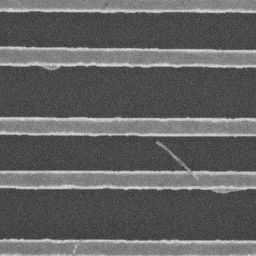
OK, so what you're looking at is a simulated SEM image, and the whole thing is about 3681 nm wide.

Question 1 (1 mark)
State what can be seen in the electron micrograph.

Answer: lines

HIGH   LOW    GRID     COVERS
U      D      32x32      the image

UUUUUUUUUUUUUUUUUUUUUUUUUUUUUUUU
DDDDDDDDDDDDDDDDDDDDDDDDDDDUDDUU
DDDDDDDDDDDDDDDDDDDDDDDDDDDDDDDD
DDDDDDDDDDDDDDDDDDDDDDDDDDDDDDDD
DDDDDDDDDDDDDDDDDDDDDDDDDDDDDDDD
DDDDDDDDDDDDDDDDDDDDDDDDDDDDDDDD
UUUUUUUUUUUUUUUUUUUUUUUUUUUUUUUU
UUUUUUUUUUUUUUUUUUUUUUUUUUUUUUUU
DDDDDDUDDDDDDDDDDDDDDDDDDDDDDDDD
DDDDDDDDDDDDDDDDDDDDDDDDDDDDDDDD
DDDDDDDDDDDDDDDDDDDDDDDDDDDDDDDD
DDDDDDDDDDDDDDDDDDDDDDDDDDDDDDDD
DDDDDDDDDDDDDDDDDDDDDDDDDDDDDDDD
DDDDDDDDDDDDDDDDDDDDDDDDDDDDDDDD
DDDDDDDDDDDDDDDDDDDDDDDDDDDDDDDD
UUUUUUUUUUUUUUUUUUUUUUUUUUUUUUUU
UUUUUUUUUUUUUUUUUUUUUUUUUUUUUUUU
DDDDDDDDDDDDDDDDDDDDDDDDDDDDDDDD
DDDDDDDDDDDDDDDDDDDDDDDDDDDDDDDD
DDDDDDDDDDDDDDDDDDDDDDDDDDDDDDDD
DDDDDDDDDDDDDDDDDDDDDDDDDDDDDDDD
UUUUUUUUUUUUUDDDDDDDDDDUDDDDDDDD
UUUUUUUUUUUUUUUUUUUUUUUUUUUUUUUU
DDUUUUUUDUUUUDUUUUUUUUUUUUUUUUUU
DDDDDDDDDDDDDDDDDDDDDDDDDDDDDDDD
DDDDDDDDDDDDDDDDDDDDDDDDDDDDDDDD
DDDDDDDDDDDDDDDDDDDDDDDDDDDDDDDD
DDDDDDDDDDDDDDDDDDDDDDDDDDDDDDDD
DDDDDDDDDDDDDDDDDDDDDDDDDDDDDDDD
DDDDDDDDDDDDDDDDDDDDDDDDDDDDDDDD
UUUUUUUUUUUUUUUUUUUUUUUUUUUUUUUU
UUUUUUUUUUUUUUUUUUUUUUUUUUUUUUUU